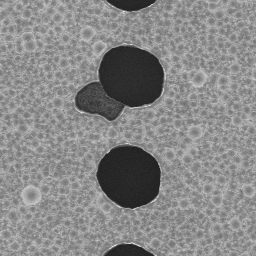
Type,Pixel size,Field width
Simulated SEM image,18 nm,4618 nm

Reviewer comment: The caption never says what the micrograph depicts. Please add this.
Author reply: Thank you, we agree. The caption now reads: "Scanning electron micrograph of holes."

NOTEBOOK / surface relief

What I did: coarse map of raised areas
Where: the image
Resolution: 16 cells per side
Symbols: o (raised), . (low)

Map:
ooooooo..ooooooo
oooooooooooooooo
oooooooooooooooo
ooooooo...oooooo
oooooo....oooooo
ooooo.....oooooo
ooooo....ooooooo
oooooooooooooooo
oooooooooooooooo
ooooooo..ooooooo
oooooo....oooooo
oooooo....oooooo
ooooooo..ooooooo
oooooooooooooooo
oooooooooooooooo
ooooooo..ooooooo